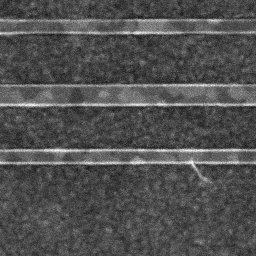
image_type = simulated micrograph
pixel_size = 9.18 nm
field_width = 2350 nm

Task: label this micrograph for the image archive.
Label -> one or a few lines or trenches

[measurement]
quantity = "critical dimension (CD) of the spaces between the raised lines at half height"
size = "448 nm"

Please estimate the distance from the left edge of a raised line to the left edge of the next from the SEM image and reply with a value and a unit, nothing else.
598 nanometers